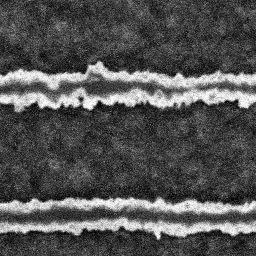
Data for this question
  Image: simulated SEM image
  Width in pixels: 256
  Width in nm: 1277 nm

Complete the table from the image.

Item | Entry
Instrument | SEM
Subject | one or a few lines or trenches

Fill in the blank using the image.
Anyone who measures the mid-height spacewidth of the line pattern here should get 525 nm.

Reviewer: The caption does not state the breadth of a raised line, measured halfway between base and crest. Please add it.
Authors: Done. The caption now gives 114 nm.